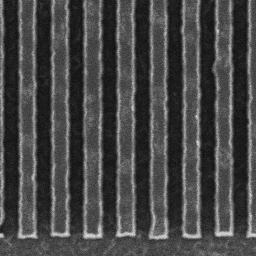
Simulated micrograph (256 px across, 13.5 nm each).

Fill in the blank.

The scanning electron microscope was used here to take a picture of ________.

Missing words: parallel lines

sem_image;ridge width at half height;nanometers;229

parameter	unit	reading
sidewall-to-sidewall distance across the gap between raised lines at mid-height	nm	207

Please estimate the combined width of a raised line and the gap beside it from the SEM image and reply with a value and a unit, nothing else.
441 nm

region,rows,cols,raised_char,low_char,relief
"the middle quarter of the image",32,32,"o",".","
o....ooooo...ooooo....oooo....oo
o....ooooo...ooooo....oooo....oo
o....ooooo...ooooo....oooo....oo
o....oooo....ooooo....oooo....oo
o....oooo....ooooo....oooo....oo
o....oooo....ooooo....oooo....oo
o....oooo....ooooo....oooo....oo
o....ooooo...ooooo....oooo....oo
o....oooo....oooo.....oooo....oo
o....oooo....oooo.....oooo....oo
o....ooooo...ooooo....oooo....oo
o....ooooo...ooooo....oooo....oo
o....ooooo...oooo.....oooo....oo
o....oooo....ooooo....oooo....oo
o....oooo....ooooo....oooo....oo
o....oooo....ooooo....oooo....oo
o....oooo....ooooo....oooo....oo
o....oooo....oooo.....oooo....oo
o....oooo....oooo.....oooo....oo
o....oooo....ooooo....oooo....oo
o....oooo....ooooo....oooo....oo
o....oooo....ooooo....oooo....oo
o....ooooo...ooooo....oooo....oo
o....ooooo....oooo....oooo....oo
o....ooooo...oooo.....oooo....oo
o....oooo....ooooo....oooo....oo
o....oooo....oooo.....oooo....oo
o....ooooo...oooo.....oooo....oo
o....oooo....oooo.....oooo....oo
o....oooo....oooo.....oooo....oo
o....oooo....ooooo....oooo....oo
o....oooo....oooo.....oooo....oo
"